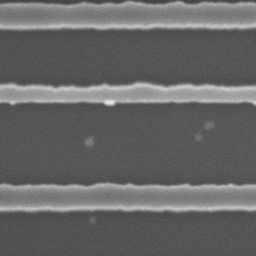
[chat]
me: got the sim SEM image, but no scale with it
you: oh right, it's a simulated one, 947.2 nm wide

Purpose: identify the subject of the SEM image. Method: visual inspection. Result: lines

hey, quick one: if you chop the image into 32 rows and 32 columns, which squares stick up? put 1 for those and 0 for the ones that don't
01111100001101111100011001111111
11111111111111111111111111111111
11111111111111111111111111111111
00000000000000000000000000000000
00000000000000000000000000000000
00000000000000000000000000000000
00000000000000000000000000000000
00000000000000000000000000000000
00000000000000000000000000000000
00000000000000000000000000000000
00000000000000000000000000000000
11111111111111111111111111111111
11111111111111111111111111111111
00000000000000000000000000000000
00000000000000000000000000000000
00000000000000000000000000000000
00000000000000000000000000000000
00000000000000000000000000000000
00000000000000000000000000000000
00000000000000000000000000000000
00000000000000000000000000000000
00000000000000000000000000000000
00000000000000000000000000000000
11111111111111111111111111111111
11111111111111111111111111111111
11111111111111111111111111111111
00000000000000000000000000000000
00000000000000000000000000000000
00000000000000000000000000000000
00000000000000000000000000000000
00000000000000000000000000000000
00000000000000000000000000000000